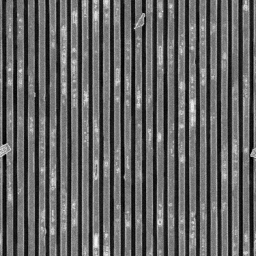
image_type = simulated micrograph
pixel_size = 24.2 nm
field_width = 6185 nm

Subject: parallel lines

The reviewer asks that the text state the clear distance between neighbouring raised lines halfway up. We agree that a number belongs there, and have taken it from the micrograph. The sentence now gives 109 nanometers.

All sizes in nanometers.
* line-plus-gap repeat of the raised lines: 260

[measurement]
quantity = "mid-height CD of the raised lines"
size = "151 nanometers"